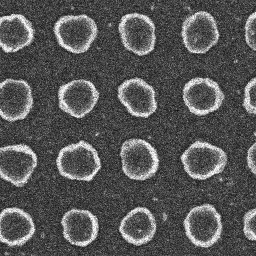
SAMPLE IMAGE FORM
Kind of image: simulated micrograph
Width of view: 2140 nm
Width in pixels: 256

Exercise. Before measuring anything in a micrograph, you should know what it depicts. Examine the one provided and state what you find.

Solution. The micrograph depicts a regular array of raised bodies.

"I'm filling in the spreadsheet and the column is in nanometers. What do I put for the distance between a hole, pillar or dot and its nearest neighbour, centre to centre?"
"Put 511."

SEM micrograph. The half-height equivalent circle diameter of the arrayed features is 0.308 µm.